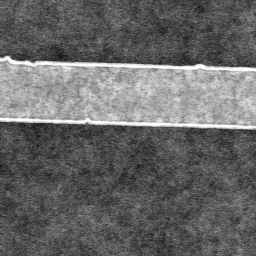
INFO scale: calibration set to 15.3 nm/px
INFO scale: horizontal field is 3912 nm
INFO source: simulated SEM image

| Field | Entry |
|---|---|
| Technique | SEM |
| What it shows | one or a few lines or trenches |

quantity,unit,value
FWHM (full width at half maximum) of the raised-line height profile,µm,0.872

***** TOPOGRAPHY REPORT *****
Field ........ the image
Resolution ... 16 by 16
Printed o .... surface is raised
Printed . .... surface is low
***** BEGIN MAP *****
................
................
................
................
oooooooooooooooo
oooooooooooooooo
oooooooooooooooo
..oooooooooooooo
................
................
................
................
................
................
................
................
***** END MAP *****